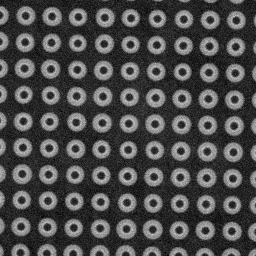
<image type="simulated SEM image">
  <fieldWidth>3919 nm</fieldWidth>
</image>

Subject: an array of small figures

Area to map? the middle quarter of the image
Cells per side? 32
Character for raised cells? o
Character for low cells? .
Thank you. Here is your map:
.oooo...oooo...ooo...oooo...ooo.
.ooooo..oooo..ooooo..oooo...oooo
.oooo...oooo..ooooo..oooo...oooo
...o....ooo....ooo...oooo...ooo.
................................
................................
.oooo...ooo....ooo....oo........
.oooo..ooooo..ooooo..oooo...ooo.
.oooo..ooooo..ooooo..oooo..ooooo
.oooo...oooo...ooo...oooo..ooooo
......................oo....ooo.
................................
..oo............................
.oooo...oooo..oooo...oooo...ooo.
.oooo..ooooo..oooo...oooo..ooooo
.oooo..ooooo..oooo..ooooo..ooooo
..oo....ooo....ooo...oooo..oooo.
................................
................................
..oo....ooo.....o.....o.........
.oooo..oooo...oooo...oooo..oooo.
.oooo..oooo...oooo...oooo..oooo.
.oooo...ooo...oooo...oooo..oooo.
...o.....o.....oo.....oo....ooo.
................................
................................
.oooo...ooo...oooo...ooo....oo..
.oooo..ooooo..oooo..ooooo..oooo.
.oooo..oooo...oooo..ooooo..oooo.
.ooo....ooo...oooo...ooo...oooo.
............................oo..
................................